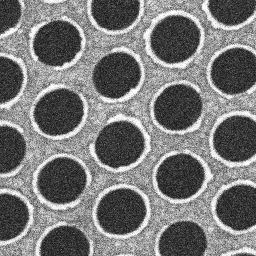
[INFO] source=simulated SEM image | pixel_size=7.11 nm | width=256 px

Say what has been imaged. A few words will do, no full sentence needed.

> a regular array of holes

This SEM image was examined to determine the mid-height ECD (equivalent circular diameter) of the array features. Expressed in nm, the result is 335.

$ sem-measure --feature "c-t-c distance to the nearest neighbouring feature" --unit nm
478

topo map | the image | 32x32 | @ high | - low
---@@@@@@@@------@@@@@@@@@------
---@@@@@@@@------@@@@@@@@@------
--@@@@@@@@@@-----@@@----@@@----@
-@@@@----@@@@---@@@------@@@@@@@
@@@@------@@@@@@@@@------@@@@@@@
@@@@------@@@@@@@@@------@@@@@@@
@@@@------@@@@@@@@@-----@@@@---@
-@@@@----@@@@----@@@---@@@@-----
---@@@@@@@@@-----@@@@@@@@@------
---@@@@@@@@@------@@@@@@@@------
---@@@@@@@@@-----@@@@@@@@@@-----
--@@@@---@@@----@@@@-----@@@--@@
-@@@@-----@@@@@@@@@------@@@@@@@
@@@@------@@@@@@@@@------@@@@@@@
@@@@------@@@@@@@@@------@@@@-@@
@@@@@-----@@@@---@@@----@@@@----
--@@@----@@@------@@@@@@@@@-----
---@@@@@@@@@------@@@@@@@@@-----
---@@@@@@@@@------@@@@@@@@@-----
---@@@@@@@@@------@@@---@@@@----
--@@@@----@@@---@@@@-----@@@@@@@
-@@@@------@@@@@@@@@-----@@@@@@@
@@@@@------@@@@@@@@@-----@@@@@@@
@@@@@------@@@@@@@@@-----@@@@---
--@@@-----@@@-----@@@---@@@@----
---@@@@@@@@@------@@@@@@@@@-----
---@@@@@@@@@------@@@@@@@@@-----
---@@@@@@@@@------@@@@@@@@@-----
---@@@@---@@@----@@@@----@@@@--@
--@@@@-----@@@@@@@@@------@@@@@@
@@@@@------@@@@@@@@@------@@@@@@
@@@@@------@@@@@@@@@------@@@@@@